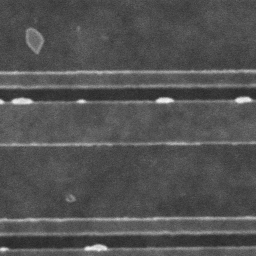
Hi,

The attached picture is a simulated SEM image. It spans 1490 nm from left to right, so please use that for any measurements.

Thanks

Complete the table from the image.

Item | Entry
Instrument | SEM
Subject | lines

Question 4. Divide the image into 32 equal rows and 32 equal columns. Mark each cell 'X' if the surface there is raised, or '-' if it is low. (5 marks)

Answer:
--------------------------------
--------------------------------
--------------------------------
--------------------------------
--------------------------------
--------------------------------
--------------------------------
--------------------------------
--------------------------------
XXXXXXXXXXXXXXXXXXXXXXXXXXXXXXXX
XXXXXXXXXXXXXXXXXXXXXXXXXXXXXXXX
--------------------------------
--XX----------------XX-------XXX
XXXXXXXXXXXXXXXXXXXXXXXXXXXXXXXX
XXXXXXXXXXXXXXXXXXXXXXXXXXXXXXXX
XXXXXXXXXXXXXXXXXXXXXXXXXXXXXXXX
XXXXXXXXXXXXXXXXXXXXXXXXXXXXXXXX
XXXXXXXXXXXXXXXXXXXXXXXXXXXXXXXX
--------------------------------
--------------------------------
--------------------------------
--------------------------------
--------------------------------
--------------------------------
--------------------------------
--------------------------------
--------------------------------
XXXXXXXXXXXXXXXXXXXXXXXXXXXXXXXX
XXXXXXXXXXXXXXXXXXXXXXXXXXXXXXXX
--------------------------------
--------------------------------
XXXXXXXXXXXXXXXXXXXXXXXXXXXXXXXX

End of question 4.